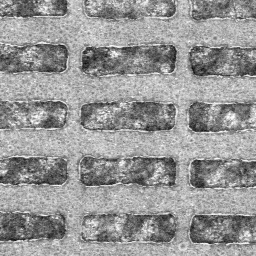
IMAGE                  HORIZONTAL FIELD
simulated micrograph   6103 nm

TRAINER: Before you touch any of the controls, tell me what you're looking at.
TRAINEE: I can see holes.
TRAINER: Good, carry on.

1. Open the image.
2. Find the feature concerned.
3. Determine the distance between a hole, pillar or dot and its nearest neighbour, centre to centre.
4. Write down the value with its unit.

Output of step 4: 1330 nanometers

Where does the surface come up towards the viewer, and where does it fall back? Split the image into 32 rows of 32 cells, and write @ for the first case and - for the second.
--------@@------------@@--------
--------@@@-----------@@--------
@@@@@@@@@@@@@@@@@@@@@@@@@@@@@@@@
@@@@@@@@@@@@@@@@@@@@@@@@@@@@@@@@
@@@@@@@@@@@@@@@@@@@@@@@@@@@@@@@@
@@@@@-@@@@@@@@@@@@@@@@@@@@@@@@@@
--------@@------------@@--------
--------@@------------@@--------
--------@@------------@@--------
@@@@@@@@@@@@-@@@@@@@@@@@------@-
@@@@@@@@@@@@@@@@@@@@@@@@@@@@@@@@
@@@@@@@@@@@@@@@@@@@@@@@@@@@@@@@@
-@@@@@@@@@@@@@@@@@@@@@@@@@@@@@@@
--------@@------------@@--------
--------@@------------@---------
--------@@------------@---------
@@@@@@@@@@@@@@@@@@@@@@@@---@@@@@
@@@@@@@@@@@@@@@@@@@@@@@@@@@@@@@@
@@@@@@@@@@@@@@@@@@@@@@@@@@@@@@@@
@@@@@@@@@@@@@@@@@@@@@@@@@@@@@@@@
--------@@------------@@--------
--------@@------------@@--------
--------@@------------@@--------
@@@@@@@@@@@@@@@@@@@@@@@@------@@
@@@@@@@@@@@@@@@@@@@@@@@@@@@@@@@@
@@@@@@@@@@@@@@@@@@@@@@@@@@@@@@@@
--@@@@@@@@@@@@@@@@@@@@@@@@@@@@@@
--------@@------------@@--------
--------@@------------@@--------
--------@@------------@@--------
@@@@@@@@@@@@@@@@@@@@@@@@@@-@-@@@
@@@@@@@@@@@@@@@@@@@@@@@@@@@@@@@@